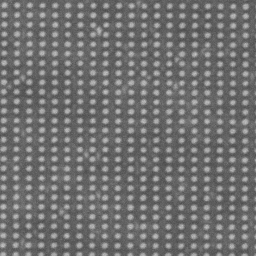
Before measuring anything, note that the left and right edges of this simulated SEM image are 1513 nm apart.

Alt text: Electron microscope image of a regular array of raised bodies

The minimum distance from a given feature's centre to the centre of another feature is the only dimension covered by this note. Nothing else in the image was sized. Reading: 0.0561 um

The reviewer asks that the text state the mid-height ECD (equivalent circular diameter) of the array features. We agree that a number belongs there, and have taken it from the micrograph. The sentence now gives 29 nanometres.